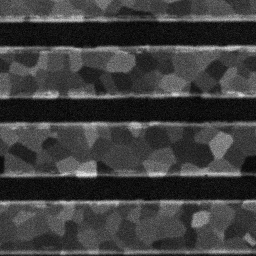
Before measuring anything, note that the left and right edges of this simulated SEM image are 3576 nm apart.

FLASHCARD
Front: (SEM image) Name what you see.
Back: one or a few lines or trenches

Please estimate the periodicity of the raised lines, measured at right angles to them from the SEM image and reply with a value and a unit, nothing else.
1080 nm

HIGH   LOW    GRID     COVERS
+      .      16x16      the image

++++++++++++++++
................
................
++++++++++++++++
++++++++++++++++
++++++++++++++++
................
................
++++++++++++++++
++++++++++++++++
++++++++++++++++
................
................
++++++++++++++++
++++++++++++++++
++++++++++++++++